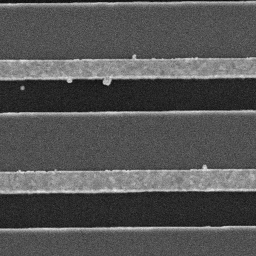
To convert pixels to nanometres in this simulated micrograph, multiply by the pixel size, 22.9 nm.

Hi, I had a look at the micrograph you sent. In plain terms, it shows lines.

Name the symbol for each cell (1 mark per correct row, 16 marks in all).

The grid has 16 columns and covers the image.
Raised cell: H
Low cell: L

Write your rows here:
HHHHHHHHHHHHHHHH
HHHHHHHHHHHHHHHH
HHHHHHHHHHHHHHHH
HHHHHHHHHHHHHHHH
HHHHHHHHHHHHHHHH
LLLLLLLLLLLLLLLL
LLLLLLLLLLLLLLLL
HHHHHHHHHHHHHHHH
HHHHHHHHHHHHHHHH
HHHHHHHHHHHHHHHH
HHHHHHHHHHHHHHHH
HHHHHHHHHHHHHHHH
LLLLLLLLLLLLLLLL
LLLLLLLLLLLLLLLL
HHHHHHHHHHHHHHHH
HHHHHHHHHHHHHHHH